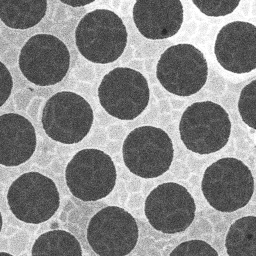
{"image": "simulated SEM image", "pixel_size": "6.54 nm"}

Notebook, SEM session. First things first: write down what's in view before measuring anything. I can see a regular array of holes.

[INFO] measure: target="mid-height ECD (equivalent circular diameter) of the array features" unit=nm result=328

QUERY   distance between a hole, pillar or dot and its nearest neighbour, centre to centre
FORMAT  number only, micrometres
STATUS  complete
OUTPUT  0.398